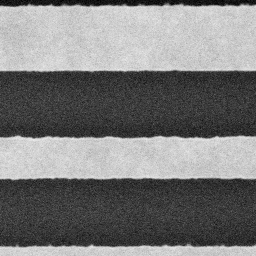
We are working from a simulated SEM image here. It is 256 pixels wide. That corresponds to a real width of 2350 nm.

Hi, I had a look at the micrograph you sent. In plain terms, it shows lines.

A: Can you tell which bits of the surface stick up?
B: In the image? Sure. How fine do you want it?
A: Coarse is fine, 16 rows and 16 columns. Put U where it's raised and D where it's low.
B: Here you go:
UUUUUUUUUUUUUUUU
UUUUUUUUUUUUUUUU
UUUUUUUUUUUUUUUU
UUUUUUUUUUUUUUUU
DDDDDDDDDDDDDDDD
DDDDDDDDDDDDDDDD
DDDDDDDDDDDDDDDD
DDDDDDDDDDDDDDDD
DDDDDDDDDDDDDDDD
UUUUUUUUUUUUUUUU
UUUUUUUUUUUUUUUU
DDDDDDDDDDDDDDDD
DDDDDDDDDDDDDDDD
DDDDDDDDDDDDDDDD
DDDDDDDDDDDDDDDD
UUUUUUUUUUUUUUUU